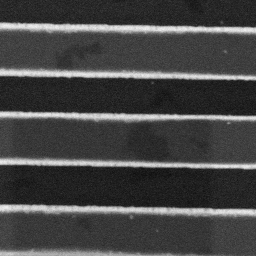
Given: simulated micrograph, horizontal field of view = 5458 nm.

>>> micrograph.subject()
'lines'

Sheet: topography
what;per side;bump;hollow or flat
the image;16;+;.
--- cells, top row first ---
................
................
++++++++++++++++
++++++++++++++++
++++++++++++++++
................
................
++++++++++++++++
++++++++++++++++
++++++++++++++++
................
................
................
++++++++++++++++
++++++++++++++++
++++++++++++++++